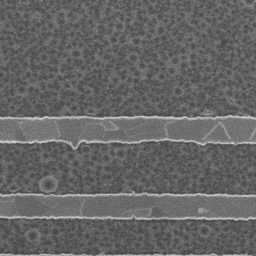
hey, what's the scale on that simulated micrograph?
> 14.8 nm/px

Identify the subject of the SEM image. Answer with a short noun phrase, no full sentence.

one or a few lines or trenches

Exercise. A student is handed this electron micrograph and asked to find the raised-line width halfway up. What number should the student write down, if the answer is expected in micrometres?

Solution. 0.356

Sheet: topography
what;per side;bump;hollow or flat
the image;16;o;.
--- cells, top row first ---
................
................
................
................
................
................
................
oooooooooooooooo
oooooooooooooooo
................
................
................
oooooooooooooooo
oooooooooooooooo
................
................